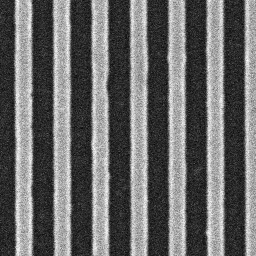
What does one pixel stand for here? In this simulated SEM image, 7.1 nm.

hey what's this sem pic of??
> parallel lines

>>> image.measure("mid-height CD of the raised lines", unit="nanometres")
104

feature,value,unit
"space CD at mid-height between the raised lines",165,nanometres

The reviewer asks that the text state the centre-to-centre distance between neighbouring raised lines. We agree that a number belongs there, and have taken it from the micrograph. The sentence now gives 272 nm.